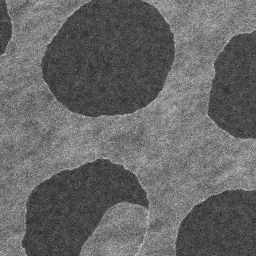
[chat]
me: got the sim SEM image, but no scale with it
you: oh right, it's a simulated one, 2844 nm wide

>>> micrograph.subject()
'raised bodies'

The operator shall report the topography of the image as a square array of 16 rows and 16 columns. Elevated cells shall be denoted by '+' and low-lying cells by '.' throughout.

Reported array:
.....+++++......
+...+++++++.....
+..++++++++...++
...++++++++...++
...++++++++..+++
...+++++++...+++
....+++++....+++
.............+++
...............+
................
.....+++........
..+++++++.......
..+++++++....+++
..++++......++++
..++++.....+++++
.++++......+++++